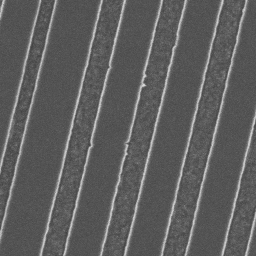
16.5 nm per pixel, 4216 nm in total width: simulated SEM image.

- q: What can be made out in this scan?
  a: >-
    parallel lines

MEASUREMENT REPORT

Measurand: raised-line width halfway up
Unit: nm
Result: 601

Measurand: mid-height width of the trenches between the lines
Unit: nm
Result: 365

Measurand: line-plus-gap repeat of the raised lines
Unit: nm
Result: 993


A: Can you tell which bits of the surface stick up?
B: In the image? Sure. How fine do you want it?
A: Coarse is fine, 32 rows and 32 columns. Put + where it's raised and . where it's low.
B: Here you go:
+++++..++++++..+++++...+++++...+
+++++..+++++...+++++...++++...++
++++..++++++...+++++...++++...++
++++..++++++...++++...+++++...++
++++..++++++...++++...+++++...++
++++..+++++...+++++...+++++...++
++++..+++++...+++++...++++...+++
+++..++++++...++++...+++++...+++
+++..++++++...++++...+++++...+++
+++..++++++..+++++...+++++...+++
+++..+++++...+++++...++++...++++
++..++++++...++++...+++++...++++
++..++++++...++++...+++++...++++
++..++++++..+++++...+++++...++++
++..+++++...+++++...++++...+++++
+..++++++...+++++..+++++...+++++
+..++++++...++++...+++++...+++++
+..++++++..+++++...+++++...++++.
+..+++++...+++++...++++...+++++.
..++++++...+++++...++++...+++++.
..++++++...++++...+++++...+++++.
..++++++...++++...+++++...++++..
..+++++...+++++...++++...+++++..
.++++++...+++++...++++...+++++..
.++++++...++++...+++++...+++++..
.++++++...++++...+++++...++++...
.+++++...+++++...+++++..+++++...
++++++...+++++...++++...+++++...
++++++...++++...+++++...+++++...
++++++...++++...+++++...++++...+
+++++...+++++...+++++...++++...+
+++++...+++++...++++...+++++...+